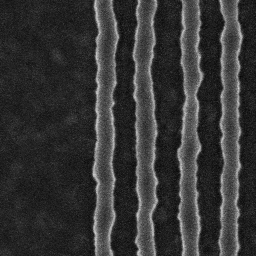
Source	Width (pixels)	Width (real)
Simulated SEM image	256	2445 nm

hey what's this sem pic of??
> parallel lines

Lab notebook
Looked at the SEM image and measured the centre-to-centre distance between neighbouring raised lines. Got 41.7 px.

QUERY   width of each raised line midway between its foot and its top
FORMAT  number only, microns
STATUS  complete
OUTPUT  0.16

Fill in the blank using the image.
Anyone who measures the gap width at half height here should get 235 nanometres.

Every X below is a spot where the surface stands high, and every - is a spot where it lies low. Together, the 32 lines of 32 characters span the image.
------------XX---XXX---XX---XX--
------------XX---XX----XX---XX--
------------XX---XX----XX---XX--
------------XXX--XX----XX---XX--
------------XXX--XX----XX---XX--
------------XXX--XX----XX---XX--
------------XX---XX----XX---XX--
------------XX---XX----XX---XX--
------------XX---XX----XX---XX--
------------XX---XX----XX---XX--
------------XX---XX----XX---XX--
------------XX---XX----XX---XX--
------------XX---XX----XX---XX--
------------XX---XX----XX---XX--
------------XX---XX----XX---XX--
------------XX---XXX---XX---XX--
------------XX---XXX---XX---XX--
------------XX---XX----XX---XX--
------------XX---XX---XXX---XX--
------------XX---XX---XXX---XX--
------------XX---XX---XXX---XX--
------------XX---XX----XX---XX--
------------XX---XXX--XXX---XX--
------------XX---XX----XX---XX--
------------XX---XX---XXX---XX--
------------XX----X---XXX---XX--
------------XX---XX---XXX---XX--
------------XX---XX---XXX---XX--
------------XX---XX----XX---XX--
------------XX---XX----XX---XX--
------------XX---XX----XX--XXX--
------------XX---XX----XX---XX--